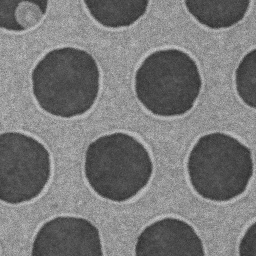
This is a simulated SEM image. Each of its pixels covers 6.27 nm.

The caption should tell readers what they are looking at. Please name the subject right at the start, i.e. holes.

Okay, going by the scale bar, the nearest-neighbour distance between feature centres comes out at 0.616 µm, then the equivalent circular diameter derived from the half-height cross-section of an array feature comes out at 442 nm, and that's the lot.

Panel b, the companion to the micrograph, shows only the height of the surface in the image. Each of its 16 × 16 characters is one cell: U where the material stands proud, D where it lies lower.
DDDUUDDDDUUUDDDD
DDUUUUDDUUUUUDDU
UUUUUUUUUUUUUUUU
UUUDDDUUUDDDUUUD
UUDDDDUUDDDDDUUD
UUDDDDUUDDDDDUUD
UUDDDDUUUDDDUUUD
UUUUUUUUUUUUUUUU
DDUUUUDDUUUUUDDU
DDDUUDDDDUUUDDDD
DDDUUDDDDDUUDDDD
DDDUUDDDDUUUDDDD
DDUUUUUDUUUUUDDU
UUUUDUUUUUUUUUUU
UUDDDDUUUDDDUUUD
UUDDDDUUDDDDDUUD